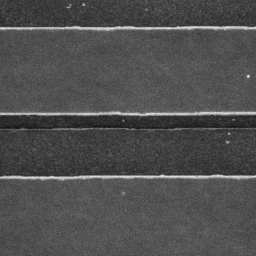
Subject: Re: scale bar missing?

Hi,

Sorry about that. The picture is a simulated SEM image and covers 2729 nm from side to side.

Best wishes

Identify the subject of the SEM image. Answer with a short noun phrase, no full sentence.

lines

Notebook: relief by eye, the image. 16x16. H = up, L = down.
LLLLLLLLLLLLLLLL
LLLLLLLLLLLLLLLL
HHHHHHHHHHHHHHHH
HHHHHHHHHHHHHHHH
HHHHHHHHHHHHHHHH
HHHHHHHHHHHHHHHH
HHHHHHHHHHHHHHHH
LLLLLLLLLLLLLLLL
LLLLLLLLLLLLLLLL
LLLLLLLLLLLLLLLL
LLLLLLLLLLLLLLLL
HHHHHHHHHHHHHHHH
HHHHHHHHHHHHHHHH
HHHHHHHHHHHHHHHH
HHHHHHHHHHHHHHHH
HHHHHHHHHHHHHHHH